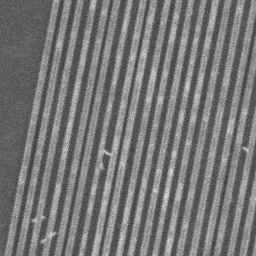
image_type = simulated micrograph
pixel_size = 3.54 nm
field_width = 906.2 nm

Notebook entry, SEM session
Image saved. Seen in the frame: parallel lines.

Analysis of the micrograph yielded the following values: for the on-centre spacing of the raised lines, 12.1 pixels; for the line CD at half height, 19.9 nm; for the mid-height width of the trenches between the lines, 23.4 nanometres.